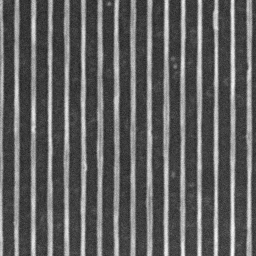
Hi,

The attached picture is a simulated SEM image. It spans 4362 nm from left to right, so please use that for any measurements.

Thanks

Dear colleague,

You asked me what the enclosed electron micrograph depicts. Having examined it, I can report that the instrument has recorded parallel lines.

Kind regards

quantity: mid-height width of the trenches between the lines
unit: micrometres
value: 0.23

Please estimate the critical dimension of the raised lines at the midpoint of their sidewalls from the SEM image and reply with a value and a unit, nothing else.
61.8 nm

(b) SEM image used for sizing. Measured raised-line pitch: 0.283 µm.